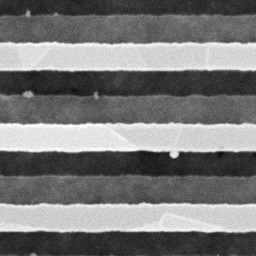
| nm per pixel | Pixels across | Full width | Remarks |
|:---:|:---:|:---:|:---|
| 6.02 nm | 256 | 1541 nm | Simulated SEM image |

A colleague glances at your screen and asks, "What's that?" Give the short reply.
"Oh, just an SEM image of lines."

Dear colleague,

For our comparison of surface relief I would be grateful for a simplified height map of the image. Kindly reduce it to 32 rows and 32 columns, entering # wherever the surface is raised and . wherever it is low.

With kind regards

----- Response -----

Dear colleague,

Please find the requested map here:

................................
................................
################################
################################
################################
################################
################################
################################
################################
................................
................................
...#............................
################################
################################
################################
################################
################################
################################
################################
.....................#..........
................................
................................
################################
################################
################################
################################
################################
################################
################################
................................
................................
................................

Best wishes